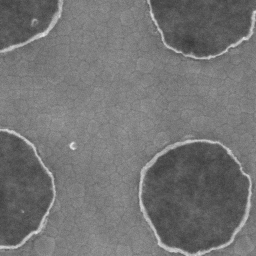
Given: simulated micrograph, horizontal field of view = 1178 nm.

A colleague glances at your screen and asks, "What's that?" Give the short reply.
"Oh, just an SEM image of raised bodies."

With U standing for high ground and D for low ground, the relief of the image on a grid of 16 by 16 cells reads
UUUUDDDDDUUUUUUU
UUUDDDDDDDUUUUUU
UUDDDDDDDDUUUUUD
DDDDDDDDDDDDUUDD
DDDDDDDDDDDDDDDD
DDDDDDDDDDDDDDDD
DDDDDDDDDDDDDDDD
DDDDDDDDDDDDDDDD
UDDDDDDDDDDDDDDD
UUDDDDDDDDUUUUDD
UUUDDDDDDUUUUUUD
UUUDDDDDDUUUUUUU
UUUDDDDDDUUUUUUU
UUUDDDDDDUUUUUUD
UUDDDDDDDDUUUUUD
DDDDDDDDDDUUUUDD